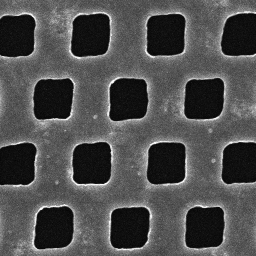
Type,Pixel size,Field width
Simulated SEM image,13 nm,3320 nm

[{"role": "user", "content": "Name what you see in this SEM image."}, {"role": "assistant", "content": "a regular array of holes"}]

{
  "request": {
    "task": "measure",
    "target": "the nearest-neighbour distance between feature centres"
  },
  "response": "958 nm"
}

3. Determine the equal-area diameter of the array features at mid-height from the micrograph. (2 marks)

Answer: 569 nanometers